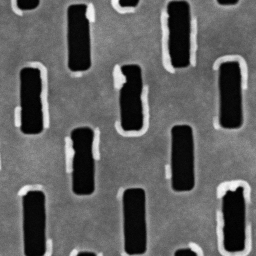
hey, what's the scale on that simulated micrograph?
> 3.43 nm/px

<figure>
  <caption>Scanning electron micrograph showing a regular array of holes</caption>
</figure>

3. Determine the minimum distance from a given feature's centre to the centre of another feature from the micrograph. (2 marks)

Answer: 270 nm